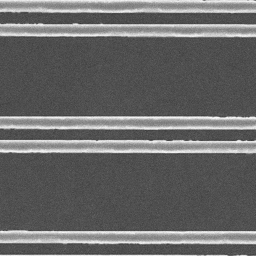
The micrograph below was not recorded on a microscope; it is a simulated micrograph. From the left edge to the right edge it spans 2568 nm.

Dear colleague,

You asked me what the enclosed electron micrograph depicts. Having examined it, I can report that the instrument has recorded lines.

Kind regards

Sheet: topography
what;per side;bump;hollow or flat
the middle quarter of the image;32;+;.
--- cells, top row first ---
................................
................................
................................
................................
................................
................................
................................
................................
................................
................................
................................
................................
................................
++++++++++++++++++++++++++++++++
++++++++++++++++++++++++++++++++
++++++++++++++++++++++++++++++++
................................
................................
................................
++++++++++++++++++++++++++++++++
++++++++++++++++++++++++++++++++
++++++++++++++++++++++++++++++++
................................
................................
................................
................................
................................
................................
................................
................................
................................
................................